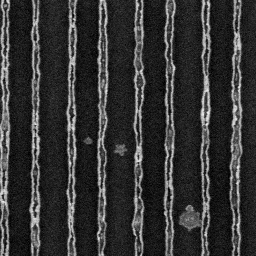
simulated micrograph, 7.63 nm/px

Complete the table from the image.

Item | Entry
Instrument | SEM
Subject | parallel lines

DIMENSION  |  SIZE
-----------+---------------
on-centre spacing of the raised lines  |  0.253 micrometres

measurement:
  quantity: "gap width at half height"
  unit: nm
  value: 198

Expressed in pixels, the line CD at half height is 6.25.